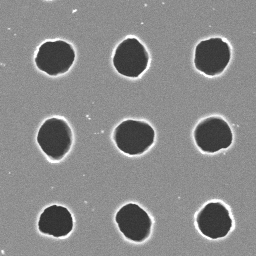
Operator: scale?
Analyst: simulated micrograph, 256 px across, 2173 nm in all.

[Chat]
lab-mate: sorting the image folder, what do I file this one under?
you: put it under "a regular array of holes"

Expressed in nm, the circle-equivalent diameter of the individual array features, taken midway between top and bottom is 302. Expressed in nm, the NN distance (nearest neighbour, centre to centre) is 667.